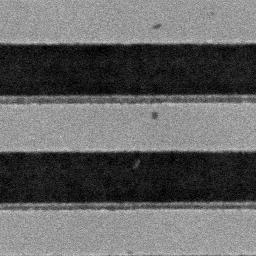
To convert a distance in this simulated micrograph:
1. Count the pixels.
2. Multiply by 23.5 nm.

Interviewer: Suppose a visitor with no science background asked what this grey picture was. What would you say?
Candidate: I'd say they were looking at lines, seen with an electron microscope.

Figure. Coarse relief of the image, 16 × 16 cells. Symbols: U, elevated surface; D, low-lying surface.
UUUUUUUUUUUUUUUU
UUUUUUUUUUUUUUUU
UUUUUUUUUUUUUUUU
DDDDDDDDDDDDDDDD
DDDDDDDDDDDDDDDD
DDDDDDDDDDDDDDDD
UUUUUUUUUUUUUUUU
UUUUUUUUUUUUUUUU
UUUUUUUUUUUUUUUU
DDDDDDDDDDDDDDDD
DDDDDDDDDDDDDDDD
DDDDDDDDDDDDDDDD
DDDDDDDDDDDDDDDD
UUUUUUUUUUUUUUUU
UUUUUUUUUUUUUUUU
UUUUUUUUUUUUUUUU